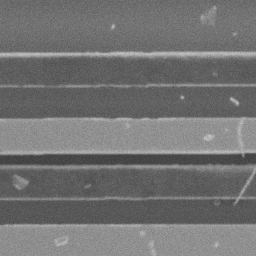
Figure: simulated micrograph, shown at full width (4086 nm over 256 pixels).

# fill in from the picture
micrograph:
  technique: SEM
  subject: lines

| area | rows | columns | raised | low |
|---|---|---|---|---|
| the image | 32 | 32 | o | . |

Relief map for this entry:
................................
................................
................................
................................
................................
................................
................................
oooooooooooooooooooooooooooooooo
oooooooooooooooooooooooooooooooo
oooooooooooooooooooooooooooooooo
oooooooooooooooooooooooooooooooo
................................
................................
................................
................................
oooooooooooooooooooooooooooooooo
oooooooooooooooooooooooooooooooo
oooooooooooooooooooooooooooooooo
oooooooooooooooooooooooooooooooo
................................
................................
oooooooooooooooooooooooooooooooo
oooooooooooooooooooooooooooooooo
oooooooooooooooooooooooooooooooo
oooooooooooooooooooooooooooooooo
................................
................................
................................
oooooooooooooooooooooooooooooooo
oooooooooooooooooooooooooooooooo
oooooooooooooooooooooooooooooooo
oooooooooooooooooooooooooooooooo